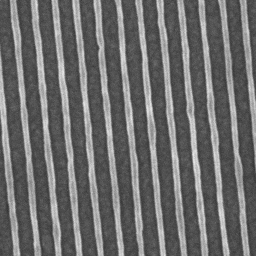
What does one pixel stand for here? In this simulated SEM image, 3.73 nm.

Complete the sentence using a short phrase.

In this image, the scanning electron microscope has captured parallel lines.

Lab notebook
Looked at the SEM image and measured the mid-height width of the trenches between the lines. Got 0.0561 microns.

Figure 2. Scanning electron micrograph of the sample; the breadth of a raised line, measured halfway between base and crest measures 18.6 nanometres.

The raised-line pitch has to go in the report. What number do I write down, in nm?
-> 77.5